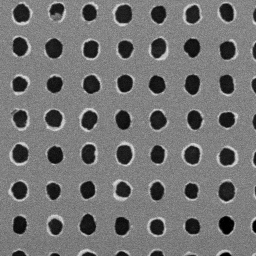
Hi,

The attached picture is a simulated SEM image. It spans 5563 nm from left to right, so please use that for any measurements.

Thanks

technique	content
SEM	a regular array of holes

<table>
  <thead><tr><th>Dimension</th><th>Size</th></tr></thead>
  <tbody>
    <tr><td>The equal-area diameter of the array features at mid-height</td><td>17.9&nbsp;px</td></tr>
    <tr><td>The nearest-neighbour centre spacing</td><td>732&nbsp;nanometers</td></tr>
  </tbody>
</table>